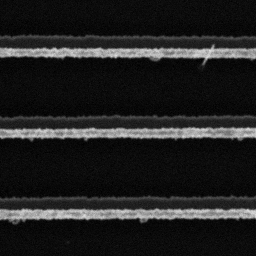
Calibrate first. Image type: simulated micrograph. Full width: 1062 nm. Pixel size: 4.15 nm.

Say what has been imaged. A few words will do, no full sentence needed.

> lines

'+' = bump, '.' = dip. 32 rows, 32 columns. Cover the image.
................................
................................
................................
................................
...+............................
++++++++++++++++++++++++++++++++
++++++++++++++++++++++++++++++++
...................+............
................................
................................
................................
................................
................................
................................
..............+.............+.+.
++++++++++++++++++++++++++++++++
++++++++++++++++++++++++++++++++
................................
................................
................................
................................
................................
................................
................................
................................
++++++++++++++++++++++++++++++++
++++++++++++++++++++++++++++++++
.++..............++.............
................................
................................
................................
................................